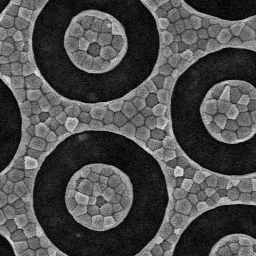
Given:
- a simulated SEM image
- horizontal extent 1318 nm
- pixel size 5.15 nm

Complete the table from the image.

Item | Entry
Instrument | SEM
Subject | ring-shaped grooves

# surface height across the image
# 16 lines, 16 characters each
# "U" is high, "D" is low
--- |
UUUDDDDDDUUUDDDD
UUDDUUUDDDUUUUUU
UUDDUUUUDDUUUUUU
UUDDUUUUDDUUUDDD
UUDDDDDDDUUDDDDD
DUUDDDDDUUUDDUUU
DUUUUUUUUUUDDUUU
DUUUUUUUUUUDDUUU
DUUUDDDDUUUDDUUU
DUUDDDDDDUUUDDDD
UUDDDUUDDDUUUDDD
UUDDUUUUDDUUUUUU
UUDDUUUUDDDUUUUU
UUDDDUUUDDUUDDDD
UUUDDDDDDDUDDDDD
DUUUDDDDDUUDDUUU